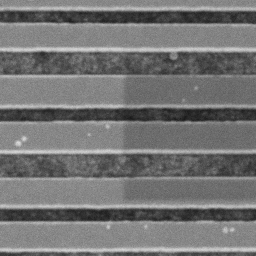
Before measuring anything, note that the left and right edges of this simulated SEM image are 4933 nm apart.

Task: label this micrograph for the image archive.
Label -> lines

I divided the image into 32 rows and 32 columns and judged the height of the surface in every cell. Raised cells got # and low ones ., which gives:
################################
................................
................................
################################
################################
################################
................................
................................
................................
################################
################################
################################
################################
........#.......................
................................
################################
################################
################################
################################
................................
................................
................................
################################
################################
################################
################################
................................
................................
################################
################################
################################
................................